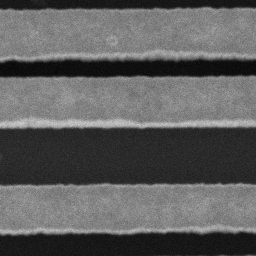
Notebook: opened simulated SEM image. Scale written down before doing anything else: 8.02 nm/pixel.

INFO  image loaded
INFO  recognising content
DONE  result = lines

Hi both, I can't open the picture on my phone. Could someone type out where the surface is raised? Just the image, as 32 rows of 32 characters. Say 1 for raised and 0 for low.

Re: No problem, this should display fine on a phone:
00000000000000000000000000000000
11111111111111111111111111111111
11111111111111111111111111111111
11111111111111111111111111111111
11111111111111111111111111111111
11111111111111111111111111111111
11111111111111111111111111111111
10111100000000000000000000000000
00000000000000000000000000000000
00000000000000000000000000000001
11111111111111111111111111111111
11111111111111111111111111111111
11111111111111111111111111111111
11111111111111111111111111111111
11111111111111111111111111111111
11111111111111111111111111111111
00000000000000000000000000000000
00000000000000000000000000000000
00000000000000000000000000000000
00000000000000000000000000000000
00000000000000000000000000000000
00000000000000000000000000000000
00000000000000000000000000000000
11111111111111111111111111111111
11111111111111111111111111111111
11111111111111111111111111111111
11111111111111111111111111111111
11111111111111111111111111111111
11111111111111111111111111111111
00000000000000000000000000000000
00000000000000000000000000000000
00000000000000000000000000000000